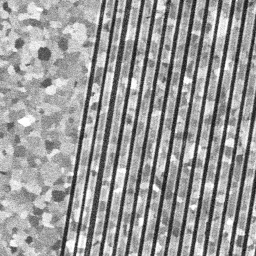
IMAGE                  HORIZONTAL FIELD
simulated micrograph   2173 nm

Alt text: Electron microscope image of parallel lines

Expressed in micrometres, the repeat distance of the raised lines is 0.108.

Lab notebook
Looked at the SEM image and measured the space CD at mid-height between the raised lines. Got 40.9 nanometres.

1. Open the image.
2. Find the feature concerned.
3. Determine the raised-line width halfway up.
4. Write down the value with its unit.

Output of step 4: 0.0649 um